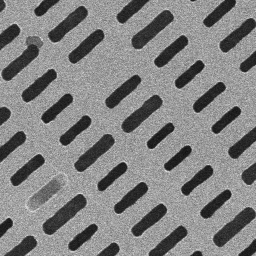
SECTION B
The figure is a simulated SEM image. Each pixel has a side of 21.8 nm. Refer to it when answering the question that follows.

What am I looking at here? a regular array of holes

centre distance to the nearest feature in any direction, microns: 0.627